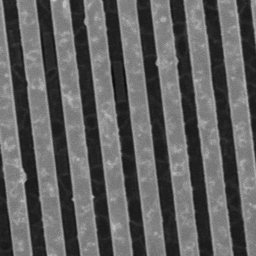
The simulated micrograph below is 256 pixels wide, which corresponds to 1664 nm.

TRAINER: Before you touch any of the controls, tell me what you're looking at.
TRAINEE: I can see parallel lines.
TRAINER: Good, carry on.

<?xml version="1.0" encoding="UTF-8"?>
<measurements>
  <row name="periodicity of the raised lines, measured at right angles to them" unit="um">0.216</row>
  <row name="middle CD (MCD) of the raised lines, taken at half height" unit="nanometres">120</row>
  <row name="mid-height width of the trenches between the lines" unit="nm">101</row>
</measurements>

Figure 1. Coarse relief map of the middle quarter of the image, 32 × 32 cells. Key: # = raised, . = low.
###....#####...#####....####....
###....#####....####....####....
###....#####....####....####....
####...#####....####....#####...
####....####....####....#####...
####....####....####....#####...
####....####....####....#####...
####....####....####.....####...
####....#####...#####....####...
####....#####...#####....####...
####....#####....####....####...
####....#####....####....#####..
#####...#####....####....#####..
#####....####....####....#####..
#####....####....####....#####..
.####....####....#####...#####..
.####....#####...#####....####..
.####....#####...#####....####..
.####....#####....####....####..
.####....#####....####....####..
.#####...#####....####....#####.
.#####....####....####....#####.
.#####....####....####....#####.
.#####....####....####....#####.
..####....####....####.....####.
..####....#####...#####....####.
..####....#####...#####....####.
..####....#####....####....####.
..####....#####....####....#####
..####....#####....####....#####
..#####....####....####....#####
..#####....####....#####...#####